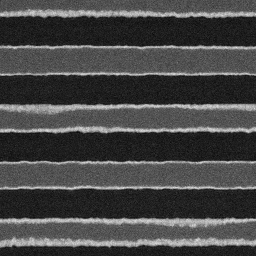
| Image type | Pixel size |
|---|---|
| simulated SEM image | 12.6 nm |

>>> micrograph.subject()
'lines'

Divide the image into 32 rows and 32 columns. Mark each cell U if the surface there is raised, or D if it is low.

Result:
UUUUUUUUUUUUUUUUUUUUUUUUUUUUUUUU
UUUUUUUUUUUUUUUUUUUUUUUUUUUUUUUU
DDDDDDDDDDDDDDDDDDDDDDDDDDDDDDDD
DDDDDDDDDDDDDDDDDDDDDDDDDDDDDDDD
DDDDDDDDDDDDDDDDDDDDDDDDDDDDDDDD
DDDDDDDDDDDDDDDDDDDDDDDDDDDDDDDD
UUUUUUUUUUUUUUUUUUUUUUUUUUUUUUUU
UUUUUUUUUUUUUUUUUUUUUUUUUUUUUUUU
UUUUUUUUUUUUUUUUUUUUUUUUUUUUUUUU
DDDDDDDDDDDDDDDDDDDDDDDDDDDDDDDD
DDDDDDDDDDDDDDDDDDDDDDDDDDDDDDDD
DDDDDDDDDDDDDDDDDDDDDDDDDDDDDDDD
DDDDDDDDDDDDDDDDDDDDDDDDDDDDDDDD
UUUUUUUUUUUUUUUUUUUUUUUUUUUUUUUU
UUUUUUUUUUUUUUUUUUUUUUUUUUUUUUUU
UUUUUUUUUUUUUUUUUUUUUUUUUUUUUUUU
UUUUUUUUUDUUUUDDUUUUDUUUUDUUUDUU
DDDDDDDDDDDDDDDDDDDDDDDDDDDDDDDD
DDDDDDDDDDDDDDDDDDDDDDDDDDDDDDDD
DDDDDDDDDDDDDDDDDDDDDDDDDDDDDDDD
UUUUUUUUUUUUUUUUUUUUUUUUUUUUUUUU
UUUUUUUUUUUUUUUUUUUUUUUUUUUUUUUU
UUUUUUUUUUUUUUUUUUUUUUUUUUUUUUUU
UUUUUUUUUUDDUUUUUDDUUDUUUDDUUUUU
DDDDDDDDDDDDDDDDDDDDDDDDDDDDDDDD
DDDDDDDDDDDDDDDDDDDDDDDDDDDDDDDD
DDDDDDDDDDDDDDDDDDDDDDDDDDDDDDDD
UUUUUUUUUUUUUUUUUUUUUUUUUUUUUUUU
UUUUUUUUUUUUUUUUUUUUUUUUUUUUUUUU
UUUUUUUUUUUUUUUUUUUUUUUUUUUUUUUU
UUUUUUUUUUUUUUUUUUUUUUUUUUUUUUUU
DDDDDDDDDDDDDDDDDDDDDDDDDDDDDDDD